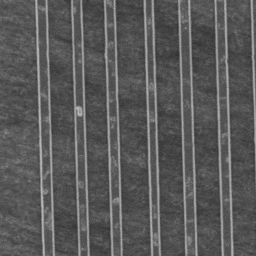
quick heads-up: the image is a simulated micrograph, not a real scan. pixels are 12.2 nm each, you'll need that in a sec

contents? parallel lines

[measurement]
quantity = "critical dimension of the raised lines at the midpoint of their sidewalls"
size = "116 nanometers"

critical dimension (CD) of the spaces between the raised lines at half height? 325 nm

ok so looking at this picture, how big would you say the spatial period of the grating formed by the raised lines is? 35.8 pixels